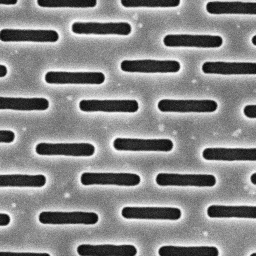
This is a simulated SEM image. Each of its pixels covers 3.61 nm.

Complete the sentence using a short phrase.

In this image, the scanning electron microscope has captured a regular array of holes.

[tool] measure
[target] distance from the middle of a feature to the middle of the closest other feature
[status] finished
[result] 175 nm